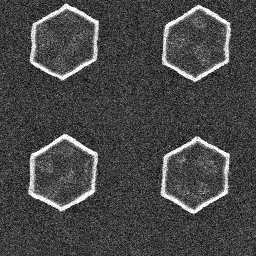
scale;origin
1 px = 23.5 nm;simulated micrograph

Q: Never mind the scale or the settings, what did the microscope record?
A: raised bodies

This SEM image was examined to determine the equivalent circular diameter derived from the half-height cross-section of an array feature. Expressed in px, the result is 66.7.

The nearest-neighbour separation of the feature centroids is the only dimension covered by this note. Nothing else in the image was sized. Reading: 3080 nanometers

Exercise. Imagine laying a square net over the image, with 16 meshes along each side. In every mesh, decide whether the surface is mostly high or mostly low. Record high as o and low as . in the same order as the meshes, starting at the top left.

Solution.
................
..oooo.....ooo..
..oooo....oooo..
..oooo....oooo..
...oo......oo...
................
................
................
................
..oooo.....ooo..
..oooo....oooo..
..oooo....oooo..
...oo......oo...
................
................
................